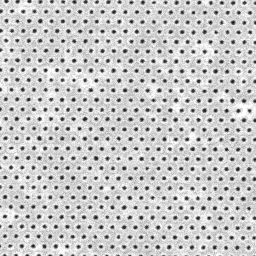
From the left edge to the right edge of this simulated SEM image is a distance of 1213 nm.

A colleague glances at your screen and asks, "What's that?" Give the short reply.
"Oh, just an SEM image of a regular array of holes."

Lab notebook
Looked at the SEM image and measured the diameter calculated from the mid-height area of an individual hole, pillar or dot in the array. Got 21.4 nm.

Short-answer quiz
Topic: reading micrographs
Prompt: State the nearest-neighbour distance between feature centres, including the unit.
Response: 0.0515 microns